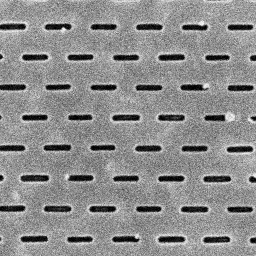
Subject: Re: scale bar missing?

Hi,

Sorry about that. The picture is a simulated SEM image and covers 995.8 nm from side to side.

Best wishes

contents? a regular array of holes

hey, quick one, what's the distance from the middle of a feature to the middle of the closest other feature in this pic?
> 145 nm